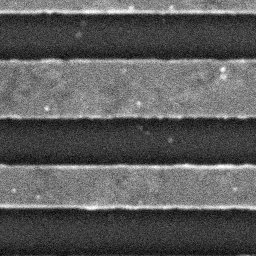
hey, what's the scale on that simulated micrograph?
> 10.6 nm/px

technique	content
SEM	lines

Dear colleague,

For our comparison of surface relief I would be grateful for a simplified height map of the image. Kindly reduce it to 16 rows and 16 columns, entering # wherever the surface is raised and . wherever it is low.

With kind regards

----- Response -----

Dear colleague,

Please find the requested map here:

################
................
................
................
################
################
################
................
................
................
################
################
################
................
................
................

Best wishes